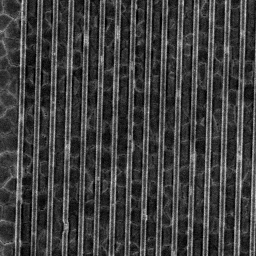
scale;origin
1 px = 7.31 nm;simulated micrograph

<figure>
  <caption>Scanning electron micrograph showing parallel lines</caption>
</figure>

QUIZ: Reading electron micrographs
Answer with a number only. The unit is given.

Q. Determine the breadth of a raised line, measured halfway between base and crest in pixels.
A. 4.5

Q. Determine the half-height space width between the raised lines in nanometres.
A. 79.5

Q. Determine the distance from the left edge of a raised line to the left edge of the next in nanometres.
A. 114